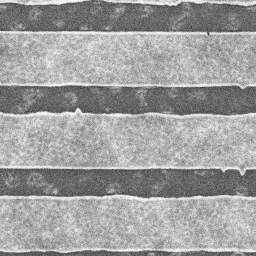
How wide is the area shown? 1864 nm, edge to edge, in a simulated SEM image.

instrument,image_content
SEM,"one or a few lines or trenches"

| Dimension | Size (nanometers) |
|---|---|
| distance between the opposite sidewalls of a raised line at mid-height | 383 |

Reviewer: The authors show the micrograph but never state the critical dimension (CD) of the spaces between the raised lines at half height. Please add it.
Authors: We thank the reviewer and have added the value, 219 nm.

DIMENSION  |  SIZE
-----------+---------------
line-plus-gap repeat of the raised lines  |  600 nanometers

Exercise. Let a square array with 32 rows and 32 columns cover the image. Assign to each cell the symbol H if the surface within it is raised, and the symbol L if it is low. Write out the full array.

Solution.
LLLLLLLLLLLLLLLLLLLLLHLLLLLLLLHL
LLLLLLLLLLLLLLLLLLLLLLLLLLLLLLLL
LLLLLLLLLLLLLLLLLLLLLLLLLLLLLLLL
LLLLLLLLLLLLLLLLLLLLLLLLLLLLLLLL
HHHHHHHHHHHHHHHHHHHHHHHHHHHHHHHH
HHHHHHHHHHHHHHHHHHHHHHHHHHHHHHHH
HHHHHHHHHHHHHHHHHHHHHHHHHHHHHHHH
HHHHHHHHHHHHHHHHHHHHHHHHHHHHHHHH
HHHHHHHHHHHHHHHHHHHHHHHHHHHHHHHH
HHHHHHHHHHHHHHHHHHHHHHHHHHHHHHHH
HHHHHHHHLLHHHHHHHHHHHHHHHHHHHHHH
LLLLLLLLLLLLLLLLLLLLLLLLLLLLLLLL
LLLLLLLLLLLLLLLLLLLLLLLLLLLLLLLL
LLLLLLLLLLLLLLLLLLLLLLLLLLLLLLLL
HHHHHHHHHHHHHHHLHHHHHLLLHHHHLHHH
HHHHHHHHHHHHHHHHHHHHHHHHHHHHHHHH
HHHHHHHHHHHHHHHHHHHHHHHHHHHHHHHH
HHHHHHHHHHHHHHHHHHHHHHHHHHHHHHHH
HHHHHHHHHHHHHHHHHHHHHHHHHHHHHHHH
HHHHHHHHHHHHHHHHHHHHHHHHHHHHHHHH
HHHHHHHHHHHHHHHHHHHHHHHHHHHHHHHH
LLLLLLLLLLLLLLLLLLLLLLLLLLLLLLLL
LLLLLLLLLLLLLLLLLLLLLLLLLLLLLLLL
LLLLLLLLLLLLLLLLLLLLLLLLLLLLLLLL
LLLLLLLLLLLLLLLLLLLLLLLLLLLLLLLL
HHHHHHHHHHHHHHHHHHHHHHHHHHHHHHHH
HHHHHHHHHHHHHHHHHHHHHHHHHHHHHHHH
HHHHHHHHHHHHHHHHHHHHHHHHHHHHHHHH
HHHHHHHHHHHHHHHHHHHHHHHHHHHHHHHH
HHHHHHHHHHHHHHHHHHHHHHHHHHHHHHHH
HHHHHHHHHHHHHHHHHHHHHHHHHHHHHHHH
LLLLLLLLLLLLLLLLLLLLLLLLLLLLLLLL